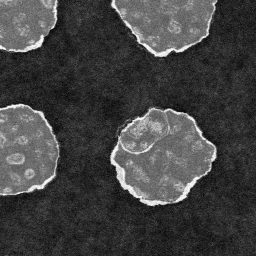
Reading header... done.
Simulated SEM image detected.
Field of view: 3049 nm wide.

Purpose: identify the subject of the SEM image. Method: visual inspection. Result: raised bodies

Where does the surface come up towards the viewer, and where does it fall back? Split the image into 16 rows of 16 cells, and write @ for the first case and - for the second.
@@@@---@@@@@@---
@@@-----@@@@@---
@@@------@@@@---
----------------
----------------
----------------
----------------
@@@-------@@----
@@@-------@@@---
@@@@---@@@@@@---
@@@@---@@@@@@---
@@@-----@@@@----
---------@@-----
----------------
----------------
----------------